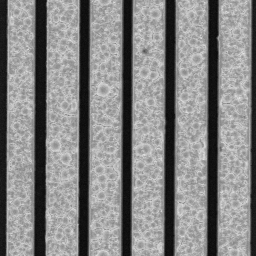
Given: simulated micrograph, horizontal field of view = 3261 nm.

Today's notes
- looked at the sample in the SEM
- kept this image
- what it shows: parallel lines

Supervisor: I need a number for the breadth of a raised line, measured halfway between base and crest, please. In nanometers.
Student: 406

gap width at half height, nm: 138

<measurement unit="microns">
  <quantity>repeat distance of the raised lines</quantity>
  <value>0.544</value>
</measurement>